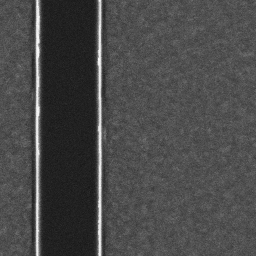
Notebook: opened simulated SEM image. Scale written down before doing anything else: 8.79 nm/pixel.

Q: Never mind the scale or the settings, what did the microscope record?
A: one or a few lines or trenches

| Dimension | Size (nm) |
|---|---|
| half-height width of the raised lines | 557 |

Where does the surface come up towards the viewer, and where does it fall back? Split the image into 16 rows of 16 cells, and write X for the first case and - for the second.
--XXXX----------
--XXXX----------
--XXXX----------
--XXXX----------
--XXXX----------
--XXXX----------
--XXXX----------
--XXXX----------
--XXXX----------
--XXXX----------
--XXXX----------
--XXXX----------
--XXXX----------
--XXXX----------
--XXXX----------
--XXXX----------